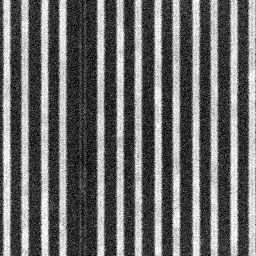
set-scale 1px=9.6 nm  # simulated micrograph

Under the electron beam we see parallel lines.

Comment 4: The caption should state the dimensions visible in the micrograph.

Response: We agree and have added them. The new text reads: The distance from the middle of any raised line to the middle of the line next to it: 181 nanometres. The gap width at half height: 0.133 microns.